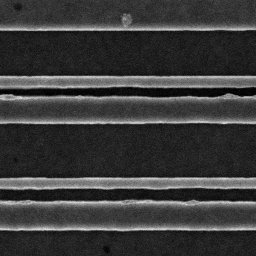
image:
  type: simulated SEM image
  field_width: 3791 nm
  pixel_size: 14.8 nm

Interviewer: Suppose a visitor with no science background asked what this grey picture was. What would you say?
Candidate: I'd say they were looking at lines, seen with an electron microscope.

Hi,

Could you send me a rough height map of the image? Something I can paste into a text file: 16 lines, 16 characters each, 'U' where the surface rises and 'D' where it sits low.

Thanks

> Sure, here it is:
UUUUUUUUUUUUUUUU
UUUUUUUUUUUUUUUU
DDDDDDDDDDDDDDDD
DDDDDDDDDDDDDDDD
DDDDDDDDDDDDDDDD
UUUUUUUUUUUUUUUU
UUUUUUUUUUUUUUUU
UUUUUUUUUUUUUUUU
DDDDDDDDDDDDDDDD
DDDDDDDDDDDDDDDD
DDDDDDDDDDDDDDDD
UUUUUUUUUUUUUUUU
UUUUUUUUUUUUUUUU
UUUUUUUUUUUUUUUU
DDDDDDDDDDDDDDDD
DDDDDDDDDDDDDDDD